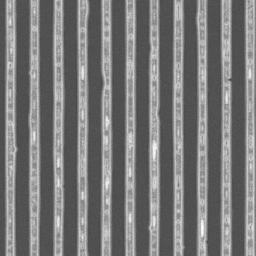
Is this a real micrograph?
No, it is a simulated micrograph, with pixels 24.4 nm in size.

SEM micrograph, parallel lines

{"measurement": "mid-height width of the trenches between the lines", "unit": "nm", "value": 378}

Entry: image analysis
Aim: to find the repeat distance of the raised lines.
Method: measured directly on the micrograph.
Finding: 586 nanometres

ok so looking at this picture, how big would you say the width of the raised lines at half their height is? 211 nm